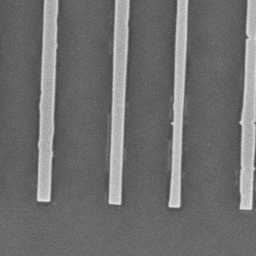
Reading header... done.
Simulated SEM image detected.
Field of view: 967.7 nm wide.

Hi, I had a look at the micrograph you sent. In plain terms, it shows one or a few lines or trenches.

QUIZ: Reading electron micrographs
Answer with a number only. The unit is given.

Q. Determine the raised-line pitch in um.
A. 0.251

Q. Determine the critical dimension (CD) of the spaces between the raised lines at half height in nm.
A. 223